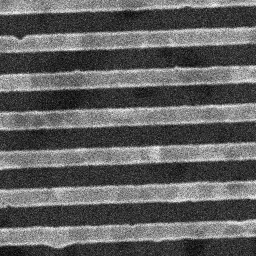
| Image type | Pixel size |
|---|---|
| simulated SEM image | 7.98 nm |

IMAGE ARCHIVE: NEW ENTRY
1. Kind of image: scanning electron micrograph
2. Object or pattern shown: parallel lines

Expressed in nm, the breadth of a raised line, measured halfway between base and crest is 130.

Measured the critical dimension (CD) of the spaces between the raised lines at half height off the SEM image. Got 178 nanometers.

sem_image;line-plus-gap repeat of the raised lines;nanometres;308